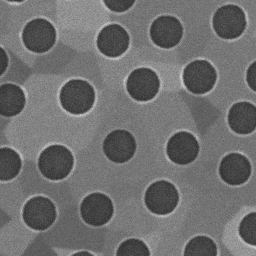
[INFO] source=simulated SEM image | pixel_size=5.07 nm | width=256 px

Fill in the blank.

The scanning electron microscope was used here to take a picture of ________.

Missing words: a regular array of holes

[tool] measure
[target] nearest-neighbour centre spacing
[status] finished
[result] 279 nm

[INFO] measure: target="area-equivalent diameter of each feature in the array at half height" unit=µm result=0.174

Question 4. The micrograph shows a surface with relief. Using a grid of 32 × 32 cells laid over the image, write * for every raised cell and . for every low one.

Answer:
*************....***************
**************.************...**
****..*************...*****....*
***....******..****....****....*
***....*****....***....****...**
***....*****....***...**********
.***..*******...****************
.*******************************
.*****************.****....****.
****************....***....****.
..******...*****....***....****.
...****.....****....****..******
...****.....*****..*************
...*****...******************...
..**************************....
*****************************...
**************..******.******...
*************....****....*******
.*****..*****....****....*******
..***....****....****....***...*
...**....*************..***....*
..***....******************....*
.*****.*********************...*
******************....**********
***********..*****....**********
***....***....****....**********
***....***....*****..***********
***....***....****************..
****..************************..
*************************.****..
***************...*****....****.
**********.****....****....*****